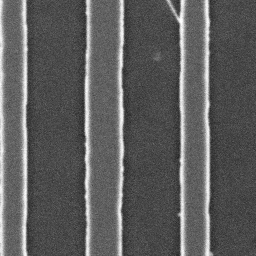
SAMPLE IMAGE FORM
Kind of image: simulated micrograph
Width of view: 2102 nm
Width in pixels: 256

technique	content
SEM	lines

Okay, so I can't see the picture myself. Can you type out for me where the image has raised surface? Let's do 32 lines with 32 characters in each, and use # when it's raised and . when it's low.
###........####........###......
###........####........###......
###........####.......####......
###........####........###......
###........####........###......
###........####........###......
###........####........###......
###........####........###......
###........####........###......
###........####........###......
###........####........###......
###........####........###......
###........####........###......
###........####........###......
###........####........###......
###........####........###......
###........####........###......
###........####........###......
###........####........###......
###........####........###......
###........####........###......
###........####........###......
###........####........###......
###........####........###......
###........####........###......
###........####........###......
###........####........###......
###........####........###......
###........####........###......
###........####........###......
###........####........###......
###........####........###......